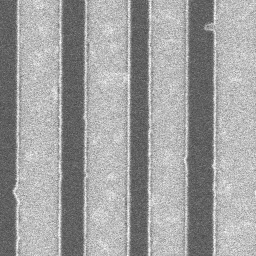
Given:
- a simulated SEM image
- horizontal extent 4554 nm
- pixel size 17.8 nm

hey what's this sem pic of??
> one or a few lines or trenches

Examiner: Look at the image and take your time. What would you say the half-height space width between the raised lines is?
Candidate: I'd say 739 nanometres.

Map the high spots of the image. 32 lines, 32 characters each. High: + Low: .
++......+++.....+++....++++.....
++......+++.....+++....++++.....
++......+++.....+++....++++.....
++......+++.....+++....+++......
++......+++.....+++....++++.....
++......+++.....+++....++++.....
++......+++.....+++....++++.....
++......+++.....+++....++++.....
++......+++.....+++....++++.....
++......+++.....+++....++++.....
++......+++.....+++....++++.....
++.....++++.....+++....++++.....
++.....++++.....+++....++++.....
++.....++++.....+++....++++.....
++.....++++.....+++....++++.....
++.....++++.....+++....++++.....
++.....++++.....+++....++++.....
++.....++++.....+++....++++.....
++.....++++.....+++....++++.....
++.....++++.....+++....++++.....
++.....++++.....+++....++++.....
++.....++++.....+++....++++.....
++.....++++.....+++....++++.....
++.....++++.....+++....++++.....
++.....++++.....+++....++++.....
++.....++++.....+++....++++.....
++.....++++.....+++....++++.....
++.....++++.....+++....++++.....
++.....++++.....+++....++++.....
++.....++++.....+++....++++.....
++.....++++.....+++....++++.....
++.....++++.....+++....++++.....